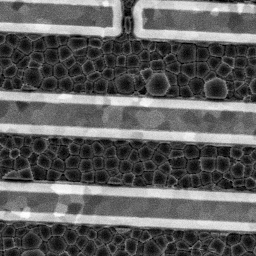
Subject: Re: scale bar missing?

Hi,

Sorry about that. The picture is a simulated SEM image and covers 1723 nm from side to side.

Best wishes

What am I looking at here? one or a few lines or trenches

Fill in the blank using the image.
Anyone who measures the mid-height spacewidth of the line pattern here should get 386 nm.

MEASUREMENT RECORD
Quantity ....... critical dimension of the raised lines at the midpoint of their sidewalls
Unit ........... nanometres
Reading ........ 210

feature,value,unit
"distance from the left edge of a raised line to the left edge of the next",91.8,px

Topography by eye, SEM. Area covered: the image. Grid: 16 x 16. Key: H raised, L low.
HHHHHHHLLHHHHHHH
HHHHHHHLLHHHHHHH
LLLLLLLLLLLLLLLL
LLLLLLLLLLLLLLLL
LLLLLLLLLLLLLLLL
LLLLLLLLLLLLLLLL
HHHHHHHHHHHHLLLL
HHHHHHHHHHHHHHHH
LLLLLLLLLHHHHHHH
LLLLLLLLLLLLLLLL
LLLLLLLLLLLLLLLL
LLLLLLLLLLLLLLLL
HHHHHHHHHHHHHHHH
HHHHHHHHHHHHHHHH
LLLLLLLLLLLLLLLL
LLLLLLLLLLLLLLLL